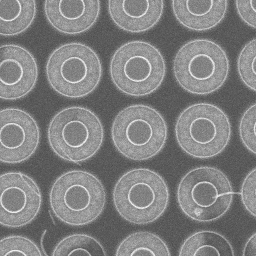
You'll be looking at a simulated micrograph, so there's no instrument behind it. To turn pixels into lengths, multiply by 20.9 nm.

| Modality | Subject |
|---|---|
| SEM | an array of small figures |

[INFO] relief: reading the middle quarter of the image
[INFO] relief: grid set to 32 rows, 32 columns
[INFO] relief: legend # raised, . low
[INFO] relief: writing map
#####....###...#######...###...#
######...###...#######...###...#
#####....###...######....###....
#####....###....#####...####....
.##.....#####...........#####...
........#####..........#######..
.......########.......#########.
.....############...############
################################
################################
#################..#############
......#########.......#########.
.......#######.........#######..
........#####...........#####...
..##.....####....####....####...
#####....###....#####....###....
######...###....######...###....
######....##....######...###....
######...###....#####....###....
#####....####....####....####...
..##.....####...........#####...
........######..........######..
.......########........#########
......###########....###########
################################
################################
##################...###########
#.....##########.......########.
........######..........######..
.........#####...........####...
..##.....####....####....####...
.#####....###....#####....###...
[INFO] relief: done